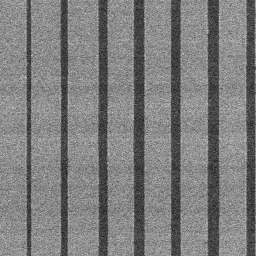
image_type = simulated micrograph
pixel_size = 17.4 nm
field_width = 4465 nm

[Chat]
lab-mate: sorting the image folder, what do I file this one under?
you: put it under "parallel lines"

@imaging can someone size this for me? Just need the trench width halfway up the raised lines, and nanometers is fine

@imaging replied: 166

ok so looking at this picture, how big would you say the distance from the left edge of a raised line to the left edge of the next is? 651 nanometres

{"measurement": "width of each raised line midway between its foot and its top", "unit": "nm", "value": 460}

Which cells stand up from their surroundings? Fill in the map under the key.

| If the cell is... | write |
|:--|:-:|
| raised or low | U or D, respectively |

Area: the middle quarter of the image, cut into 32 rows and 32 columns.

DUUUUUUUDDDUUUUUUUUDUUUUUUUDDUUU
DUUUUUUUDDDUUUUUUUUDUUUUUUUDDUUU
DUUUUUUUDDDUUUUUUDUUUUUUUUUDDUUU
DUUUUUUUDDDUUUUUUUUDUUUUUUUDDUUU
DUUUUUUUDDDUUUUUUDDDUUUUUUUDDUUU
DUUUUUUUDDDUUUUUUDDDUUUUUUUDDUUU
DUUUUUUUDDDUUUUUUDDDUUUUUUUDDUUU
DUUUUUUUDDDUUUUUUDDDUUUUUUUDDUUU
DUUUUUUUDDDUUUUUUDDDUUUUUUUDDUUU
DUUUUUUUDDDUUUUUUDDDUUUUUUUDDUUU
DUUUUUUUDDDUUUUUUDDDUUUUUUUDDUUU
DUUUUUUUDDDUUUUUUDDDUUUUUUUDDUUU
DUUUUUUUDDDUUUUUUDDDUUUUUUUDDUUU
DUUUUUUUDDDUUUUUUDDDUUUUUUUDDUUU
DUUUUUUUDDDUUUUUUDDDUUUUUUUDDUUU
DUUUUUUUDDDUUUUUUDDDUUUUUUUDDUUU
DUUUUUUUDDDUUUUUUDDDUUUUUUDDDUUU
DUUUUUUUDDDUUUUUUDDDUUUUUUDDDUUU
DUUUUUUUDDDUUUUUUDDDUUUUUUDDDUUU
DUUUUUUUDUDUUUUUUDDDUUUUUUDDDUUU
DUUUUUUUDDDUUUUUUDDDUUUUUUDDDUUU
DUUUUUUUDDDUUUUUUDDDUUUUUUDDDUUU
DUUUUUUUDDDUUUUUUDDDUUUUUUDDDUUU
DUUUUUUUDDDUUUUUUDDDUUUUUUDDDUUU
DUUUUUUUDDDUUUUUUDDDUUUUUUDDDUUU
DUUUUUUUDDDUUUUUUDDDUUUUUUDDDUUU
DUUUUUUUDDDUUUUUUDDDUUUUUUDDDUUU
DUUUUUUUDDDUUUUUUDDDUUUUUUUDDUUU
DUUUUUUUDDDUUUUUUDDDUUUUUUUDDUUU
DUUUUUUUUDDUUUUUUDDDUUUUUUUDDUUU
DUUUUUUUDDDUUUUUUDDDUUUUUUUDDUUU
DUUUUUUUDDDUUUUUUDDDUUUUUUUDDUUU